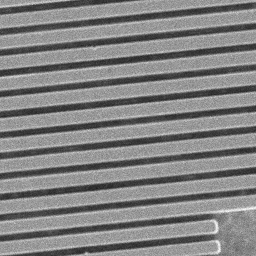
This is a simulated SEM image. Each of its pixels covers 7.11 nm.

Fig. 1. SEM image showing parallel lines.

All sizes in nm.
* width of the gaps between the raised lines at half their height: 49.4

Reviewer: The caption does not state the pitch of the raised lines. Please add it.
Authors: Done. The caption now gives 146 nm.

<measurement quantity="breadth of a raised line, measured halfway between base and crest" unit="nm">92.8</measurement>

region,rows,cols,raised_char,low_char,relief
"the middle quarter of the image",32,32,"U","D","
DDDDDDDDDDDDUUUUUUUUUUUUUUUUUUUU
DDDUUUUUUUUUUUUUUUUUUUUUUUUUUUUU
UUUUUUUUUUUUUUUUUUUUUUUDDDDDDDDD
UUUUUUUUUUUUUDDDDDDDDDDDDDDDDDDD
UUUUDDDDDDDDDDDDDDDDDDUUUUUUUUUU
DDDDDDDDDDDDDUUUUUUUUUUUUUUUUUUU
DDDUUUUUUUUUUUUUUUUUUUUUUUUUUUUU
UUUUUUUUUUUUUUUUUUUUUUUUUDDDDDDD
UUUUUUUUUUUUUUUUDDDDDDDDDDDDDDDD
UUUUDDDDDDDDDDDDDDDDDDDDDUUUUUUU
DDDDDDDDDDDDDDDUUUUUUUUUUUUUUUUU
DDDDDDUUUUUUUUUUUUUUUUUUUUUUUUUU
UUUUUUUUUUUUUUUUUUUUUUUUUUDDDDDD
UUUUUUUUUUUUUUUUDDDDDDDDDDDDDDDD
UUUUUUUDDDDDDDDDDDDDDDDDDUUUUUUU
DDDDDDDDDDDDDDDUUUUUUUUUUUUUUUUU
DDDDDDUUUUUUUUUUUUUUUUUUUUUUUUUU
UUUUUUUUUUUUUUUUUUUUUUUUUUDDDDDD
UUUUUUUUUUUUUUUUUUUDDDDDDDDDDDDD
UUUUUUUUUDDDDDDDDDDDDDDDDDDUUUUU
DDDDDDDDDDDDDDDDDDUUUUUUUUUUUUUU
DDDDDDDDUUUUUUUUUUUUUUUUUUUUUUUU
UUUUUUUUUUUUUUUUUUUUUUUUUUUUDDDD
UUUUUUUUUUUUUUUUUUUDDDDDDDDDDDDD
UUUUUUUUUDDDDDDDDDDDDDDDDDDDUUUU
DDDDDDDDDDDDDDDDDDUUUUUUUUUUUUUU
DDDDDDDDDUUUUUUUUUUUUUUUUUUUUUUU
UUUUUUUUUUUUUUUUUUUUUUUUUUUUUUUD
UUUUUUUUUUUUUUUUUUUUUDDDDDDDDDDD
UUUUUUUUUUUUDDDDDDDDDDDDDDDDDDUU
UUDDDDDDDDDDDDDDDDDDDUUUUUUUUUUU
DDDDDDDDDDDUUUUUUUUUUUUUUUUUUUUU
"